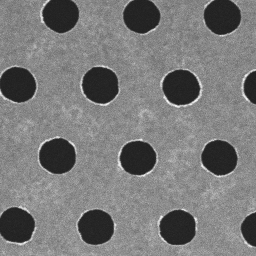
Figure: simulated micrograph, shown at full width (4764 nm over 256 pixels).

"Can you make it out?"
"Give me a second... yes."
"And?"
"holes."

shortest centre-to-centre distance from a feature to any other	80.3	pixels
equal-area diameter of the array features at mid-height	680	nanometres